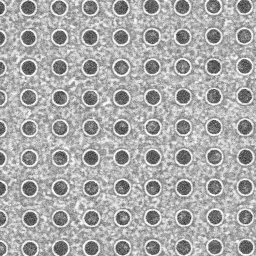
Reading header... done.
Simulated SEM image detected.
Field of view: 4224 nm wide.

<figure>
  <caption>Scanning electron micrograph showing a regular array of holes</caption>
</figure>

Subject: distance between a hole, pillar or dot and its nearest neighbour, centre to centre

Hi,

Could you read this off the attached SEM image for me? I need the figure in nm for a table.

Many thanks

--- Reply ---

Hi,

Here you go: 495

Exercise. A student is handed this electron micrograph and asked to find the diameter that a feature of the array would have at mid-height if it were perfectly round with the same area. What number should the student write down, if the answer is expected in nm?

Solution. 253